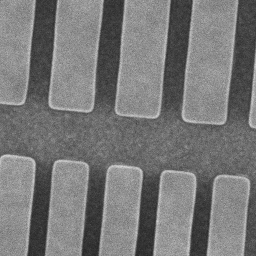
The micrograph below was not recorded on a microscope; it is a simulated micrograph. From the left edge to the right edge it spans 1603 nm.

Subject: groups of lines, slits or small figures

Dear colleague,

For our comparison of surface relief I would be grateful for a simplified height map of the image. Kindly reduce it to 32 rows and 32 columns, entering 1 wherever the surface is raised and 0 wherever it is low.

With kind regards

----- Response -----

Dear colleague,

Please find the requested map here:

11110001111110001111100011111100
11110001111110001111100011111100
11110001111110011111100011111100
11110001111110011111100011111000
11110001111100011111100011111000
11110001111100011111100011111000
11110001111100011111100011111000
11110001111100011111100111111000
11110011111100011111100111111000
11110011111100011111000111111000
11110011111100011111000111111000
11100011111100011111000111111001
11100011111100111111000111111001
00000001111100111111000111110001
00000000000000001111000111110001
00000000000000000000000000010001
00000000000000000000000000000000
00000000000000000000000000000000
00000000000000000000000000000000
11100000000000000000000000000000
11110001111000000000000000000000
11110001111001111100111000000000
11110011111001111100111100011110
11110011111001111100111100011110
11110011111001111100111100011110
11110011111001111000111100111110
11110011111001111000111100111110
11110011111001111000111100111110
11110011110001111001111100111110
11110011110001111001111100111110
11110011110011111001111100111110
11100011110011111001111100111100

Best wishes